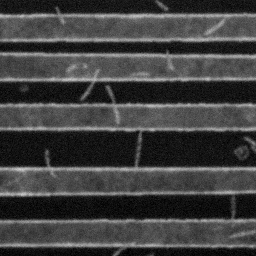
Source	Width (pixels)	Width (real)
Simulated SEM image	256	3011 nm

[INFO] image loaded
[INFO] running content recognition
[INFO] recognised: lines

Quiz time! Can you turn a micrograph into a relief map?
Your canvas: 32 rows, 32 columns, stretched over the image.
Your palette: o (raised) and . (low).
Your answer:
................................
................................
oooooooooooooooooooooooooooooooo
oooooooooooooooooooooooooooooooo
oooooooooooooooooooooooooooooooo
................................
................................
oooooooooooooooooooooooooooooooo
oooooooooooooooooooooooooooooooo
oooooooooooooooooooooooooooooooo
................................
................................
................................
oooooooooooooooooooooooooooooooo
oooooooooooooooooooooooooooooooo
oooooooooooooooooooooooooooooooo
................................
................................
................................
................................
................................
oooooooooooooooooooooooooooooooo
oooooooooooooooooooooooooooooooo
oooooooooooooooooooooooooooooooo
................................
................................
................................
.....................o......oooo
oooooooooooooooooooooooooooooooo
oooooooooooooooooooooooooooooooo
oooooooooooooooooooooooooooooooo
................................